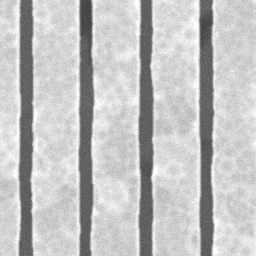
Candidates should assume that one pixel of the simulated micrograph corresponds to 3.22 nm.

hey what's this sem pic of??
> lines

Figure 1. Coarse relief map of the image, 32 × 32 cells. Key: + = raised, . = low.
++..++++++..+++++..++++++..+++++
++..++++++..+++++..++++++..+++++
++..++++++..+++++..++++++..+++++
++..++++++..+++++..++++++..+++++
++..++++++..+++++..++++++..+++++
++..++++++..+++++..++++++..+++++
++..++++++..+++++..++++++..+++++
++..++++++..+++++..++++++..+++++
++..++++++..+++++..++++++..+++++
++..++++++..+++++..++++++..+++++
++..++++++..+++++..++++++..+++++
++..++++++..+++++..++++++..+++++
++..++++++..+++++..++++++..+++++
++..++++++..+++++..++++++..+++++
++..++++++..+++++..++++++..+++++
++..++++++..+++++..++++++..+++++
++..++++++..+++++..++++++..+++++
++..++++++..+++++..++++++..+++++
++..++++++..+++++..++++++..+++++
++..++++++..+++++..++++++..+++++
++..++++++..+++++..++++++..+++++
++..++++++..+++++..++++++..+++++
++..++++++..+++++..++++++..+++++
++..++++++..+++++..++++++..+++++
++..++++++..+++++..++++++..+++++
++..++++++..+++++..++++++..+++++
++..++++++..+++++..++++++..+++++
++..++++++..+++++..++++++..+++++
++..++++++..+++++..++++++..+++++
++..++++++.++++++..++++++..+++++
++..++++++.++++++..++++++..+++++
++..++++++.++++++..++++++..+++++